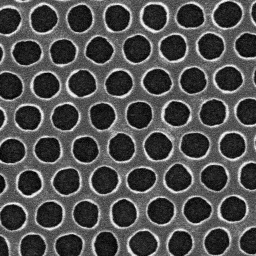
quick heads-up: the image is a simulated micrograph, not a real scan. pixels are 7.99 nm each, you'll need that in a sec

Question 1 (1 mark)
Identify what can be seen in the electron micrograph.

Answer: a regular array of holes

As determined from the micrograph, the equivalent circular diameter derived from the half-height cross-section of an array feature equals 0.217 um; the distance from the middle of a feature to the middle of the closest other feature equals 290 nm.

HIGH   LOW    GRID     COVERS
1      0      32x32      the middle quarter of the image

11111111111111111111111111111111
11110111111111111111110001111100
11000001111100001111100000111000
10000000111000000111000000011000
10000000110000000111000000011000
10000000110000000111000000011000
10000000111000000111100000111100
11000001111000001111110001111110
11111111111111111111111111111111
11111111111111111000111111000111
00111111000011110000011110000001
00011100000001110000001110000001
00001100000001100000001110000000
00001110000001110000001110000001
00011110000011110000001111000001
00011110000011111000011111100011
01111111101111111111111111111111
11111111111110011111110001111110
11110001111100000111100000111000
11000000111000000111000000011000
11000000111000000011000000011000
11000000011000000011000000011000
11000000011100000011100000111100
11100000111100000111100000111111
11110001111110011111111111111111
11111111111111111111111111100011
00011111000001111000001111000001
00001110000001110000000110000000
00001110000000110000000110000000
00001110000000110000000110000000
00001110000001110000001111000001
00001111000001111000011111100011